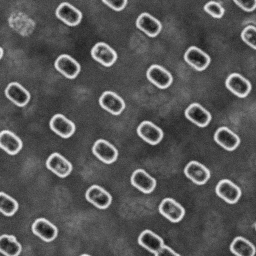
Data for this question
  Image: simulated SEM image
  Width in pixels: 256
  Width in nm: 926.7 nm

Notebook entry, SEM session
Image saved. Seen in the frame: a regular array of raised bodies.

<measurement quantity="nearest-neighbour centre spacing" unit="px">41.5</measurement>